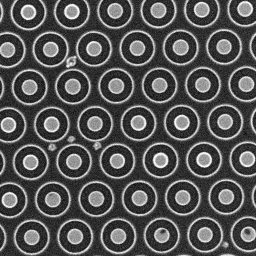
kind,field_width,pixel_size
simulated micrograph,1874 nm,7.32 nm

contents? an array of small figures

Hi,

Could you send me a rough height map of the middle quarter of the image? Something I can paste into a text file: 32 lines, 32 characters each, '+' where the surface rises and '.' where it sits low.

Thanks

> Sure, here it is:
++++++++++++++++++++++++++++++++
++++++++++++..++++++++...+++++++
.....+++++......+++++......+++++
......+++........+++........+++.
.+++..+++...+++..+++..++++..+++.
++++..+++..++++..+++..++++..+++.
.+++..+++...+++..+++...++...+++.
......+++........+++.......++++.
.....+++++......+++++.....++++++
+...++++++++..++++++++++++++++++
+++++++++++++++++++++++++++++.++
++++++....++++++.....++++++.....
++++.......++++.......++++......
.+++...++...+++..+++...++...+++.
.+++..+++...+++..+++...++...+++.
.+++..+++...+++..+++...++...+++.
.+++...++...+++.......++++......
+++++......+++++......++++......
++++++....+++++++...++++++++...+
++++++++++++++++++++++++++++++++
+...++++++++...+++++++....++++++
.....+++++......+++++......+++++
......++++.......+++........+++.
.+++..+++...+++..+++...+++..+++.
.+++...++...+++..+++...+++..+++.
.+++..+++...+++..+++...++...+++.
......++++.......++++......+++++
.....++++++.....++++++....++++++
++.+++++++++++++++++++++++++++++
++++++++++++++++++..+++++++++..+
++++++.....+++++......+++++.....
.++++......++++.......++++......